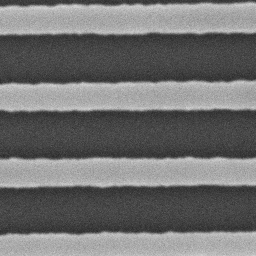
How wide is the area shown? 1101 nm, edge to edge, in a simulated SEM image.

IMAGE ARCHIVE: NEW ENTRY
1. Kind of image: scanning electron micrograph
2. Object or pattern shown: lines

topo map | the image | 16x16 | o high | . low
oooooooooooooooo
oooooooooooooooo
................
................
................
oooooooooooooooo
oooooooooooooooo
................
................
................
oooooooooooooooo
oooooooooooooooo
................
................
................
oooooooooooooooo